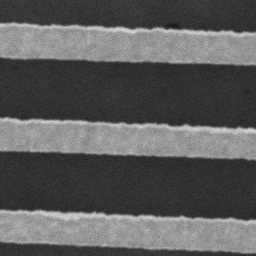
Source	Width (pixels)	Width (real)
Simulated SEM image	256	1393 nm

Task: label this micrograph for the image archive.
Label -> lines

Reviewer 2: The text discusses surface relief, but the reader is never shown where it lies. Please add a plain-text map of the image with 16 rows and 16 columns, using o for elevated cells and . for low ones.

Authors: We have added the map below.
................
oo..............
oooooooooooooooo
oooooooooooooooo
................
................
................
o.o.............
oooooooooooooooo
...ooooooooooooo
................
................
................
ooooooooo.......
oooooooooooooooo
.........ooooooo